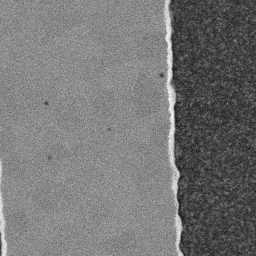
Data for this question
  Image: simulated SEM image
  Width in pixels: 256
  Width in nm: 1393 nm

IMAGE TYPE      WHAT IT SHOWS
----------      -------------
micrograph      one or a few lines or trenches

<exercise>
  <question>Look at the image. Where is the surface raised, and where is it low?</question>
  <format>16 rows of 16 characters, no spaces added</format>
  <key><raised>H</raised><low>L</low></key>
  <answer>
HHHHHHHHHHHLLLLL
HHHHHHHHHHHLLLLL
HHHHHHHHHHHLLLLL
HHHHHHHHHHHLLLLL
HHHHHHHHHHHLLLLL
HHHHHHHHHHHLLLLL
HHHHHHHHHHHLLLLL
HHHHHHHHHHHLLLLL
HHHHHHHHHHHLLLLL
HHHHHHHHHHHLLLLL
HHHHHHHHHHHLLLLL
HHHHHHHHHHHLLLLL
HHHHHHHHHHHLLLLL
HHHHHHHHHHHLLLLL
HHHHHHHHHHHLLLLL
HHHHHHHHHHHLLLLL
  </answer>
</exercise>